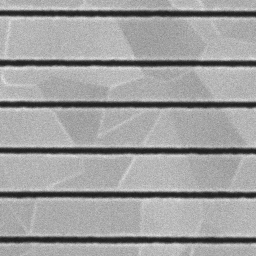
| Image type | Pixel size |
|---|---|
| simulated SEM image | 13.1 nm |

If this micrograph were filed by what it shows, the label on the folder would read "lines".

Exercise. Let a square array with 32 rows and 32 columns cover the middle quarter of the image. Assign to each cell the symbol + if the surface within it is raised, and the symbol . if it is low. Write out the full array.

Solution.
................................
++++++++++++++++++++++++++++++++
++++++++++++++++++++++++++++++++
++++++++++++++++++++++++++++++++
++++++++++++++++++++++++++++++++
++++++++++++++++++++++++++++++++
++++++++++++++++++++++++++++++++
++++++++++++++++++++++++++++++++
++++++++++++++++++++++++++++++++
................................
................................
++++++++++++++++++++++++++++++++
++++++++++++++++++++++++++++++++
++++++++++++++++++++++++++++++++
++++++++++++++++++++++++++++++++
++++++++++++++++++++++++++++++++
++++++++++++++++++++++++++++++++
++++++++++++++++++++++++++++++++
++++++++++++++++++++++++++++++++
++++++++++++++++++++++++++++++++
++++++++++++++++++++++++++++++++
................................
................................
++++++++++++++++++++++++++++++++
++++++++++++++++++++++++++++++++
++++++++++++++++++++++++++++++++
++++++++++++++++++++++++++++++++
++++++++++++++++++++++++++++++++
++++++++++++++++++++++++++++++++
++++++++++++++++++++++++++++++++
++++++++++++++++++++++++++++++++
++++++++++++++++++++++++++++++++